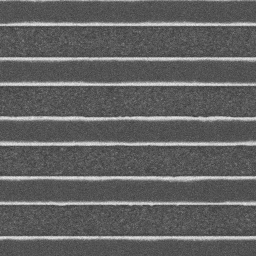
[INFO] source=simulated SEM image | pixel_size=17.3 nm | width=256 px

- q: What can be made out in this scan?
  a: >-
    lines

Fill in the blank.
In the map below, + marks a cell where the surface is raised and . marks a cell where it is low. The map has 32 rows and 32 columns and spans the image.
++++++++++++++++++++++++++++++++
++++++++++++++++++++++++++++++++
++++++++++++++++++++++++++++++++
................................
................................
................................
................................
++++++++++++++++++++++++++++++++
++++++++++++++++++++++++++++++++
++++++++++++++++++++++++++++++++
++++++++++++++++++++++++++++++++
................................
................................
................................
................................
++++++++++++++++++++++++++++++++
++++++++++++++++++++++++++++++++
++++++++++++++++++++++++++++++++
................................
................................
................................
................................
++++++++++++++++++++++++++++++++
++++++++++++++++++++++++++++++++
++++++++++++++++++++++++++++++++
++++++++++++++++++++++++++++++++
................................
................................
................................
................................
++++++++++++++++++++++++++++++++
++++++++++++++++++++++++++++++++